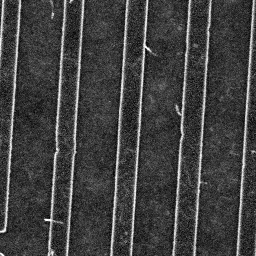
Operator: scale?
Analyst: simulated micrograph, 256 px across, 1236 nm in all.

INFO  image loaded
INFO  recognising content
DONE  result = one or a few lines or trenches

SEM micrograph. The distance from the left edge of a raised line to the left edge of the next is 303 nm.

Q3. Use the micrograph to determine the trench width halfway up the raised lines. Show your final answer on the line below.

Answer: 0.203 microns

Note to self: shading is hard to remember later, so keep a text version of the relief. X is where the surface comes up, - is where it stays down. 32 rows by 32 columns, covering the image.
XXX-----XX------XX------XX------
XX------XX------XX------XX------
XX------XX------XX------XX------
XX------XX------XX-----XXX-----X
XX------XX------XX-----XXX-----X
XX------XX------XX-----XXX-----X
XX------XX-----XXX-----XXX-----X
XX------XX-----XXX-----XXX-----X
XX------XX-----XXX-----XXX-----X
XX------XX-----XXX-----XXX-----X
XX-----XXX-----XXX-----XXX-----X
XX-----XXX-----XXX-----XXX-----X
XX-----XXX-----XXX-----XXX-----X
XX-----XXX-----XXX-----XXX-----X
XX-----XXX-----XXX-----XX------X
XX-----XX------XX------XX------X
X------XX------XX------XX------X
X------XX------XX------XX------X
X------XX------XX------XX------X
X------XX------XX-----XXX-----XX
X------XX------XX-----XXX-----XX
X------XX------XX-----XXX-----XX
X------XX-----XXX-----XXX-----XX
X------XX-----XXX-----XXX-----XX
X------XX-----XXX-----XXX-----XX
X-----XXX-----XXX-----XXX-----XX
X-----XXX-----XXX-----XXX-----XX
X-----XXX-----XXX-----XXX-----XX
X-----XXX-----XXX-----XXX-----XX
------XXX-----XXX-----XX------XX
------XXX-----XXX-----XX------XX
------XX------XX------XX------XX